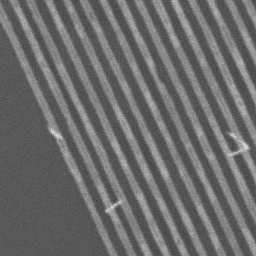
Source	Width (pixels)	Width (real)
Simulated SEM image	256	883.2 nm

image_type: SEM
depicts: parallel lines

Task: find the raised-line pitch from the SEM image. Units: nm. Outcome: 56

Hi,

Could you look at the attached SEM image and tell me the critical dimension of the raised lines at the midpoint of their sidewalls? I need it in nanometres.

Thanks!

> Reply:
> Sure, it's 18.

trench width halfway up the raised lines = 39.1 nanometres